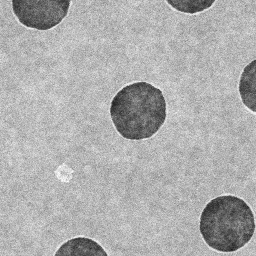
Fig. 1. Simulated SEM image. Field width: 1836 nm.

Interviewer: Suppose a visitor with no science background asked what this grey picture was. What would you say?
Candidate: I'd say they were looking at holes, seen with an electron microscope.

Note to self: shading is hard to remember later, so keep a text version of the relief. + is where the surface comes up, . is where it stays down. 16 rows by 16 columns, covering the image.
+...+++++++..+++
+...++++++++++++
++++++++++++++++
++++++++++++++++
+++++++++++++++.
++++++++..+++++.
+++++++...+++++.
+++++++...++++++
++++++++.+++++++
++++++++++++++++
++++++++++++++++
++++++++++++++++
+++++++++++++..+
+++++++++++++...
+++++++++++++...
++++..+++++++..+